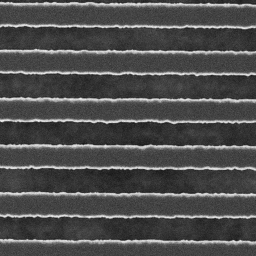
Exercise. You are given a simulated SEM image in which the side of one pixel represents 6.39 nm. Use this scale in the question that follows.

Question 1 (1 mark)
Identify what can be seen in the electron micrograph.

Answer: lines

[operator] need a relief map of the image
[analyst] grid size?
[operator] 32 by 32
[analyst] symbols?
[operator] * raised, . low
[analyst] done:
*************.*******.*..*......
********************************
********************************
..............................*.
................................
................................
***********************.******..
********************************
********************************
................................
................................
................................
********************************
********************************
********************************
................................
................................
................................
********************************
********************************
********************************
................................
................................
................................
********************************
********************************
********************************
................................
................................
................................
********************************
********************************